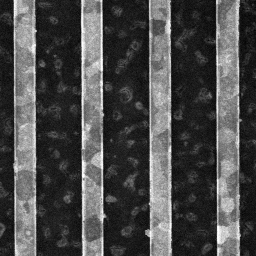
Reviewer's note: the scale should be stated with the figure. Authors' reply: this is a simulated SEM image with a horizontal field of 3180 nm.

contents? one or a few lines or trenches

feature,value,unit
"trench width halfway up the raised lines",592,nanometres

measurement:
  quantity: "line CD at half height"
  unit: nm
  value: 255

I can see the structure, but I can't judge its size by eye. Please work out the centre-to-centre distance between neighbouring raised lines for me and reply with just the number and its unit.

841 nm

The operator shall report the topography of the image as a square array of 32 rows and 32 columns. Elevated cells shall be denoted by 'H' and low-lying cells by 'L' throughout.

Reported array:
LLHHLLLLLLHHHLLLLLLHHLLLLLLHHHLL
LLHHLLLLLLHHHLLLLLLHHLLLLLLHHHLL
LLHHLLLLLLHHHLLLLLLHHLLLLLLHHHLL
LLHHLLLLLLHHHLLLLLLHHLLLLLLHHHLL
LLHHLLLLLLHHHLLLLLLHHLLLLLLHHHLL
LLHHLLLLLLHHHLLLLLLHHLLLLLLHHHLL
LLHHLLLLLLHHHLLLLLLHHLLLLLLHHHLL
LLHHLLLLLLHHHLLLLLLHHLLLLLLHHHLL
LLHHLLLLLLHHHLLLLLLHHLLLLLLHHHLL
LLHHLLLLLLHHHLLLLLLHHLLLLLLHHHLL
LLHHLLLLLLHHHLLLLLLHHLLLLLLHHHLL
LLHHLLLLLLHHHLLLLLLHHLLLLLLHHHLL
LLHHLLLLLLHHHLLLLLLHHLLLLLLHHHLL
LLHHLLLLLLHHHLLLLLLHHLLLLLLHHHLL
LLHHLLLLLLHHHLLLLLLHHLLLLLLHHHLL
LLHHLLLLLLHHHLLLLLLHHLLLLLLHHHLL
LLHHLLLLLLHHHLLLLLLHHLLLLLLHHHLL
LLHHLLLLLLHHHLLLLLLHHLLLLLLHHHLL
LLHHLLLLLLHHHLLLLLLHHLLLLLLHHHLL
LLHHLLLLLLHHHLLLLLLHHLLLLLLHHHLL
LLHHLLLLLLHHHLLLLLLHHLLLLLLHHHLL
LLHHLLLLLLHHHLLLLLLHHLLLLLLHHHLL
LLHHLLLLLLHHHLLLLLLHHLLLLLLHHHLL
LLHHLLLLLLHHHLLLLLLHHLLLLLLHHHLL
LLHHLLLLLLHHHLLLLLLHHLLLLLLHHHLL
LLHHLLLLLLHHHLLLLLLHHLLLLLLHHHLL
LLHHLLLLLLHHHLLLLLLHHLLLLLLHHHLL
LLHHLLLLLLHHHLLLLLLHHLLLLLLHHHLL
LLHHLLLLLLHHHLLLLLLHHLLLLLLHHHLL
LLHHLLLLLLHHHLLLLLLHHLLLLLLHHHLL
LLHHLLLLLLHHHLLLLLLHHLLLLLLHHHLL
LLHHLLLLLLHHHLLLLLLHHLLLLLLHHHLL